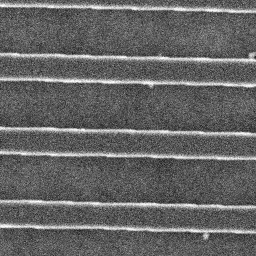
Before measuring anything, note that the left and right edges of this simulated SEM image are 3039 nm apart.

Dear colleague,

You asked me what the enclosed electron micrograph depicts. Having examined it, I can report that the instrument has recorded lines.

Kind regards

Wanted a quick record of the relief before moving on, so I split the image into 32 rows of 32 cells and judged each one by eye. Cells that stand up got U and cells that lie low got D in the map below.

UUUUUUUUUUUUUUUUUUUUUUUUUUUUUUUU
DDDDDDDDDDDDDDDDDDDDDDDDDDDDDDDD
DDDDDDDDDDDDDDDDDDDDDDDDDDDDDDDD
DDDDDDDDDDDDDDDDDDDDDDDDDDDDDDDD
DDDDDDDDDDDDDDDDDDDDDDDDDDDDDDDD
DDDDDDDDDDDDDDDDDDDDDDDDDDDDDDDD
DDDDDDDDDDDDDDDDDDDDDDDDDDDDDDDD
UUUUUUUUUUUUUUUUUUUUUUUUUUUUUUUU
UUUUUUUUUUUUUUUUUUUUUUUUUUUUUUUU
UUUUUUUUUUUUUUUUUUUUUUUUUUUUUUUU
DDDDDDDDDDDDDDDDDDDDDDDUUUUUUUUU
DDDDDDDDDDDDDDDDDDDDDDDDDDDDDDDD
DDDDDDDDDDDDDDDDDDDDDDDDDDDDDDDD
DDDDDDDDDDDDDDDDDDDDDDDDDDDDDDDD
DDDDDDDDDDDDDDDDDDDDDDDDDDDDDDDD
DDDDDDDDDDDDDDDDDDDDDDDDDDDDDDDD
UUUUUUUUUUUUUUUUUUUUUUDDDDDDDDDD
UUUUUUUUUUUUUUUUUUUUUUUUUUUUUUUU
UUUUUUUUUUUUUUUUUUUUUUUUUUUUUUUU
DDDDDDDDDDDDDUUUUUUUUUUUUUUUUUUU
DDDDDDDDDDDDDDDDDDDDDDDDDDDDDDDD
DDDDDDDDDDDDDDDDDDDDDDDDDDDDDDDD
DDDDDDDDDDDDDDDDDDDDDDDDDDDDDDDD
DDDDDDDDDDDDDDDDDDDDDDDDDDDDDDDD
DDDDDDDDDDDDDDDDDDDDDDDDDDDDDDDD
UUUUUUUUUUUUUUUUUUUUDDDDDDDDDDDD
UUUUUUUUUUUUUUUUUUUUUUUUUUUUUUUU
UUUUUUUUUUUUUUUUUUUUUUUUUUUUUUUU
DDDDDDDDDDDDDUUUUUUUUUUUUUUUUUUU
DDDDDDDDDDDDDDDDDDDDDDDDDDDDDDDD
DDDDDDDDDDDDDDDDDDDDDDDDDDDDDDDD
DDDDDDDDDDDDDDDDDDDDDDDDDDDDDDDD